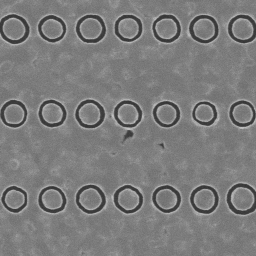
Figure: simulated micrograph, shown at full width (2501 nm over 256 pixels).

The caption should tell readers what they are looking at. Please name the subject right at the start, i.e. ring-shaped grooves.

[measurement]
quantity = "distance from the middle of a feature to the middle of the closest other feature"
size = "833 nanometres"